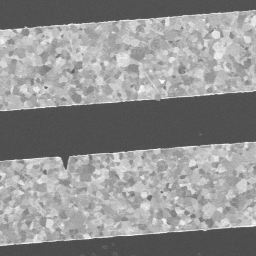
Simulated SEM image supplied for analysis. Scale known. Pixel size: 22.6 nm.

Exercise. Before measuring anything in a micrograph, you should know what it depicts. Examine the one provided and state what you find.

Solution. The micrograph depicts one or a few lines or trenches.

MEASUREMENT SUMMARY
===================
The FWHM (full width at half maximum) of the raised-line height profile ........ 1810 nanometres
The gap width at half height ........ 1.15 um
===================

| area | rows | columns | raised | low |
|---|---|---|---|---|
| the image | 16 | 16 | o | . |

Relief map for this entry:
................
.....ooooooooooo
oooooooooooooooo
oooooooooooooooo
oooooooooooooooo
oooooooooooooooo
ooooo...........
................
................
........oooooooo
oooooooooooooooo
oooooooooooooooo
oooooooooooooooo
oooooooooooooooo
oooooooooo......
................